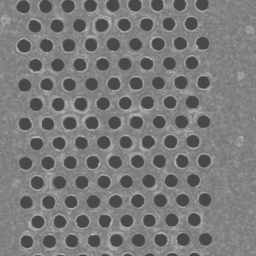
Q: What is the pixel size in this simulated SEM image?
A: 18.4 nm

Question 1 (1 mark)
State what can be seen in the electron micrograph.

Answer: a regular array of holes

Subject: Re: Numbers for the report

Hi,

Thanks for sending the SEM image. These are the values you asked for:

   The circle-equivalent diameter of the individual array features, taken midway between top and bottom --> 247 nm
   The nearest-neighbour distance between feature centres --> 408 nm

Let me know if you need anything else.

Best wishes